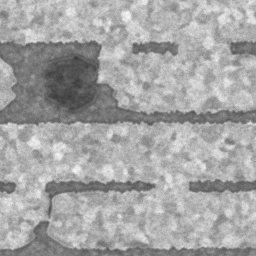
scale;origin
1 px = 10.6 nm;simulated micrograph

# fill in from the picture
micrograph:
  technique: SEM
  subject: one or a few lines or trenches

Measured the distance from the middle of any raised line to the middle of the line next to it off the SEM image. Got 727 nm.